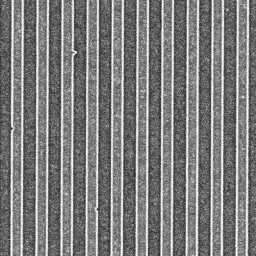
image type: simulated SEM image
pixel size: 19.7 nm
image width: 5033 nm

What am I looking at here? parallel lines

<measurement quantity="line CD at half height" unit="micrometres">0.214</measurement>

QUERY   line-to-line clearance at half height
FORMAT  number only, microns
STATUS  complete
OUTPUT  0.285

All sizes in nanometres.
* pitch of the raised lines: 492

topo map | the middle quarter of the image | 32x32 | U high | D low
UUDDDDUUDDDDUUUDDDUUUDDDDUUDDDDU
UUDDDDUUDDDDUUUDDDUUUDDDDUUDDDDU
UUDDDDUUDDDDUUUDDDUUUDDDDUUDDDDU
UUDDDDUUDDDDUUUDDDUUUDDDDUUDDDDU
UUDDDDUUDDDDUUUDDDUUUDDDDUUDDDDU
UUDDDDUUDDDDUUUDDDUUUDDDDUUDDDDU
UUDDDDUUDDDDUUUDDDUUUDDDDUUDDDDU
UUDDDDUUDDDDUUUDDDUUUDDDDUUDDDDU
UUDDDDUUDDDDUUUDDDUUUDDDDUUDDDDU
UUDDDDUUDDDDUUUDDDUUUDDDDUUDDDDU
UUDDDDUUDDDDUUUDDDUUUDDDDUUDDDDU
UUDDDDUUDDDDUUUDDDUUUDDDDUUDDDDU
UUDDDDUUDDDDUUUDDDUUUDDDDUUDDDDU
UUDDDDUUDDDDUUUDDDUUUDDDDUUDDDDU
UUDDDDUUDDDDUUUDDDUUUDDDDUUDDDDU
UUDDDDUUDDDDUUUDDDUUUDDDDUUDDDDU
UUDDDDUUDDDDUUUDDDUUUDDDDUUDDDDU
UUDDDDUUDDDDUUUDDDUUUDDDDUUDDDDU
UUDDDDUUDDDDUUUDDDUUUDDDDUUDDDDU
UUDDDDUUDDDDUUUDDDUUUDDDDUUDDDDU
UUDDDDUUDDDDUUUDDDUUUDDDDUUDDDDU
UUDDDDUUDDDDUUUDDDUUUDDDDUUDDDDU
UUDDDDUUDDDDUUUDDDUUUDDDDUUDDDDU
UUDDDDUUDDDDUUUDDDUUUDDDDUUDDDDU
UUDDDDUUDDDDUUUDDDUUUDDDDUUDDDDU
UUDDDDUUDDDDUUUDDDUUUDDDDUUDDDDU
UUDDDDUUDDDDUUUDDDUUUDDDDUUDDDDU
UUDDDDUUDDDDUUUDDDUUUDDDDUUDDDDU
UUDDDDUUDDDDUUUDDDUUUDDDDUUDDDDU
UUDDDDUUDDDDUUUDDDUUUDDDDUUDDDDU
UUDDDDUUDDDDUUUDDDUUUDDDDUUDDDDU
UUDDDDUUDDDDUUUDDDUUUDDDDUUDDDDU